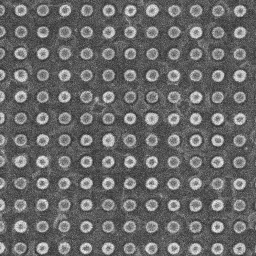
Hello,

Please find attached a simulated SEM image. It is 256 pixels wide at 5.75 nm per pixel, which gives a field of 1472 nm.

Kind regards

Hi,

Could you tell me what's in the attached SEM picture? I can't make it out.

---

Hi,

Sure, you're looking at a regular array of raised bodies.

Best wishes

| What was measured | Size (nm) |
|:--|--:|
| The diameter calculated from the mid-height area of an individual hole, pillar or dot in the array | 62.5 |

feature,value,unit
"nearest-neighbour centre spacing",123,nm